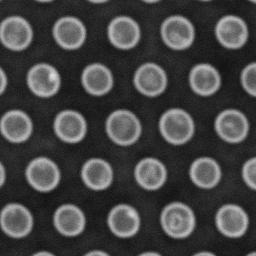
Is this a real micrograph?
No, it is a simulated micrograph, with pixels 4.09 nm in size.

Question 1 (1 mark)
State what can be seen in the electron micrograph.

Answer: a regular array of raised bodies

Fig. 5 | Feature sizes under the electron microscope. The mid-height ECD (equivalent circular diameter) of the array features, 0.124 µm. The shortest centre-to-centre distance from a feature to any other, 0.219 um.